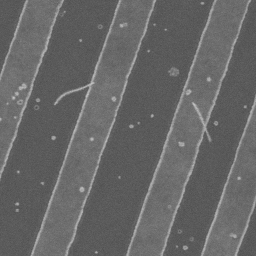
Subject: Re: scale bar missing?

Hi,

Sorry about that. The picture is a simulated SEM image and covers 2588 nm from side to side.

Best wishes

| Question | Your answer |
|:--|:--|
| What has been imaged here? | lines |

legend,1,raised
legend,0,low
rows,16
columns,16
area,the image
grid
0111000111000110
0110000110000110
0110000110000110
1110001110001100
1100001100001100
1100001100001100
1100011000011000
1000011000011001
1000011000111001
1000110000110001
0000110000110011
0000110001110011
0001100001100011
0001100001100111
0011100011100110
0011000011000110